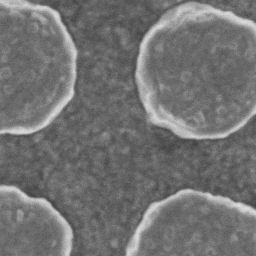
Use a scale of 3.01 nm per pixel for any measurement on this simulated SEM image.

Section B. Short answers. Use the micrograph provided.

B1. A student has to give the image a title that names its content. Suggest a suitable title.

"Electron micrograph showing raised bodies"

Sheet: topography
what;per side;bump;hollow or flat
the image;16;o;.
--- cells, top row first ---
ooo.............
oooo......oooooo
oooo.....ooooooo
ooooo....ooooooo
ooooo....ooooooo
ooooo....ooooooo
oooo.....ooooooo
ooo.......ooooo.
............oo..
................
................
................
oo........oooo..
oooo.....ooooooo
oooo.....ooooooo
oooo....oooooooo